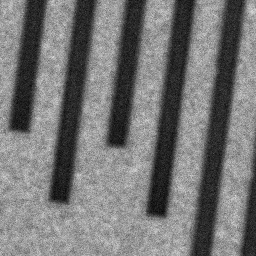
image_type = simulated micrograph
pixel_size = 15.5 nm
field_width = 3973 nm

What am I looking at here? parallel lines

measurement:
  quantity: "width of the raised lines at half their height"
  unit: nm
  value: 452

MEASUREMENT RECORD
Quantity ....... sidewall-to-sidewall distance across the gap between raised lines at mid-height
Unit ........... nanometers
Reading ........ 319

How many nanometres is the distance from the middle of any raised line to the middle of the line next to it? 763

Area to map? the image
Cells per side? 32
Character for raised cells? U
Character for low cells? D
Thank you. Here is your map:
UUUDDDUUUDDDUUUUDDUUUUDDUUUUDDDU
UUUDDDUUUDDDUUUDDDUUUUDDUUUUDDUU
UUUDDDUUUDDDUUUDDDUUUUDDUUUUDDUU
UUUDDUUUUDDDUUUDDDUUUDDDUUUUDDUU
UUUDDUUUUDDDUUUDDDUUUDDDUUUDDDUU
UUUDDUUUUDDUUUUDDDUUUDDDUUUDDDUU
UUDDDUUUUDDUUUUDDUUUUDDDUUUDDDUU
UUDDDUUUUDDUUUUDDUUUUDDUUUUDDDUU
UUDDDUUUDDDUUUUDDUUUUDDUUUUDDDUU
UUDDDUUUDDDUUUDDDUUUUDDUUUUDDUUU
UUDDUUUUDDDUUUDDDUUUDDDUUUUDDUUU
UUDDUUUUDDUUUUDDDUUUDDDUUUUDDUUU
UUDDUUUUDDUUUUDDDUUUDDDUUUDDDUUU
UDDDUUUUDDUUUUDDUUUUDDDUUUDDDUUU
UDDDUUUUDDUUUUDDUUUUDDUUUUDDDUUU
UDDDUUUDDDUUUUDDUUUUDDUUUUDDDUUU
UUDUUUUDDDUUUDDDUUUUDDUUUUDDUUUU
UUUUUUUDDDUUUDDDUUUUDDUUUUDDUUUU
UUUUUUUDDDUUUUUUUUUDDDUUUUDDUUUU
UUUUUUUDDUUUUUUUUUUDDDUUUDDDUUUU
UUUUUUUDDUUUUUUUUUUDDDUUUDDDUUUU
UUUUUUUDDUUUUUUUUUUDDDUUUDDDUUUD
UUUUUUDDDUUUUUUUUUUDDUUUUDDDUUUD
UUUUUUDDDUUUUUUUUUUDDUUUUDDDUUUD
UUUUUUDDDUUUUUUUUUUDDUUUUDDUUUUD
UUUUUUUUUUUUUUUUUUDDDUUUUDDUUUUD
UUUUUUUUUUUUUUUUUUDDDUUUUDDUUUUD
UUUUUUUUUUUUUUUUUUUUUUUUDDDUUUUD
UUUUUUUUUUUUUUUUUUUUUUUUDDDUUUDD
UUUUUUUUUUUUUUUUUUUUUUUUDDDUUUDD
UUUUUUUUUUUUUUUUUUUUUUUUDDDUUUDD
UUUUUUUUUUUUUUUUUUUUUUUUDDUUUUDD